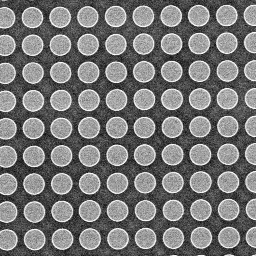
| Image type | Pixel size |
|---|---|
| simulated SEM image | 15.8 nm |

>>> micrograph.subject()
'an array of small figures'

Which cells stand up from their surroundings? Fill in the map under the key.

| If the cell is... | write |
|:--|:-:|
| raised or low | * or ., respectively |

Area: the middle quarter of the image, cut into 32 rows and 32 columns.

*...****...****...****...****...
**..*****..****..******.*****..*
**..*****..*****.******..****..*
*...****...****...****...****...
.....**.....**..................
................................
.............*.....**.....**....
*...****...****...****...****...
**..*****..*****..*****.******.*
**..*****..*****..*****.*****..*
*...****...****...****...****...
.....**.....**..................
................................
.....**.....**.....**.....**....
*...****...****...****...****...
**..*****..*****..*****..*****.*
**..*****..*****..*****..*****..
*...****...****...****...****...
................................
................................
.....**.....**.....**.....***...
**..****...****...****...****...
**..*****..*****..*****..*****..
**..*****..*****..*****..*****..
*...****...****...****...****...
................................
................................
.....**.....**.....***....***...
*...*****..*****..*****..****...
**..*****..*****..*****..*****..
**..*****..*****..*****..*****..
*...****...****...****...****...